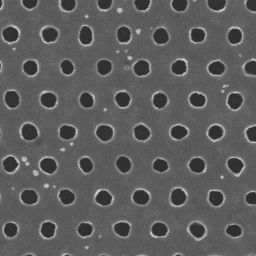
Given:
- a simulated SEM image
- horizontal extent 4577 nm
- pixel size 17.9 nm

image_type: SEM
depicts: a regular array of holes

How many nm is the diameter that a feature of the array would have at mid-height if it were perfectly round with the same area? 273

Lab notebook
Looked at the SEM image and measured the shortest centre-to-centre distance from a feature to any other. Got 0.655 microns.